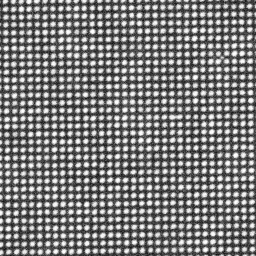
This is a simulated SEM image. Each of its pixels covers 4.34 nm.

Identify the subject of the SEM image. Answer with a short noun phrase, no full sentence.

a regular array of raised bodies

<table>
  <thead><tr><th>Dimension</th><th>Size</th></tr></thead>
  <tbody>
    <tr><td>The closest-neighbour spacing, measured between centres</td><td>32.9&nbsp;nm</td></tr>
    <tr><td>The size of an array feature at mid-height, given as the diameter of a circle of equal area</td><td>0.019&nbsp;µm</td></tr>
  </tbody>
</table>